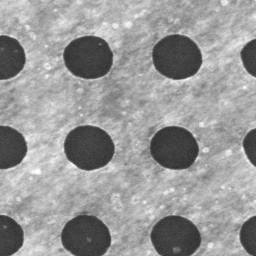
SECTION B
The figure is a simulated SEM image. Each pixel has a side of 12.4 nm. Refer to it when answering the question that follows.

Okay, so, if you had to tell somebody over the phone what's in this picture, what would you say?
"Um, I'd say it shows holes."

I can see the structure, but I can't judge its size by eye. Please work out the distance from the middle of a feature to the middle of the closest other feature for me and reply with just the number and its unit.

1.08 micrometres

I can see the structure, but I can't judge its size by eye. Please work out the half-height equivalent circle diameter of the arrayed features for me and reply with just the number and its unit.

47.8 px